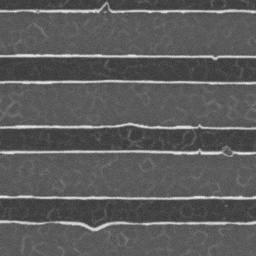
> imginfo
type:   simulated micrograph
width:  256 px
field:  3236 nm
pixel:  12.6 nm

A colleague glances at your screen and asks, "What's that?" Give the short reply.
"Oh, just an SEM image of one or a few lines or trenches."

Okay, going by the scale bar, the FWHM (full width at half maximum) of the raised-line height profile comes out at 327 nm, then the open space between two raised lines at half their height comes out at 561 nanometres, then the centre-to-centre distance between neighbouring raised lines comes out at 0.896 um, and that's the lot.